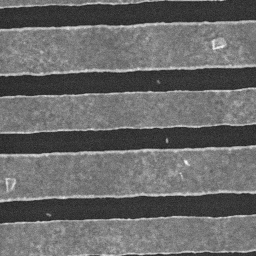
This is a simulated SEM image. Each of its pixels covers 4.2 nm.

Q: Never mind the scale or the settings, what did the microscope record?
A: lines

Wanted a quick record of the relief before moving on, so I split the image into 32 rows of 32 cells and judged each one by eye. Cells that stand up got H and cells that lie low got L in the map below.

HHHHHHHHHHHLLLLLLLLLLLLLLLLLLLLL
LLLLLLLLLLLLLLLLLLLLLLLLLLLLLLLL
LLLLLLLLLLLLLLLLLLLLLLLLLLLLLLLL
LLLHHHHHHHHHHHHHHHHHHHHHHHHHHHHH
HHHHHHHHHHHHHHHHHHHHHHHHHHHHHHHH
HHHHHHHHHHHHHHHHHHHHHHHHHHHHHHHH
HHHHHHHHHHHHHHHHHHHHHHHHHHHHHHHH
HHHHHHHHHHHHHHHHHHHHHHHHHHHHHHHH
HHHHHHHHHHHHHHHHHHHHHHHHHLLLLLLL
HLLLLLLLLLLLLLLLLLLLLLLLLLLLLLLL
LLLLLLLLLLLLLLLLLLLLLLLLLLLLLLLL
LLLLLLLLLLLLLLLLLLHLLHHHHHHHHHHH
HHHHHHHHHHHHHHHHHHHHHHHHHHHHHHHH
HHHHHHHHHHHHHHHHHHHHHHHHHHHHHHHH
HHHHHHHHHHHHHHHHHHHHHHHHHHHHHHHH
HHHHHHHHHHHHHHHHHHHHHHHHHHHHHHHH
HHHHHLLLLLLLLLLLLLLLLLLLLLLLLLLL
LLLLLLLLLLLLLLLLLLLLLLLLLLLLLLLL
LLLLLLLLLLLLLLLLLLLLLLLLLHHHHHHH
HHHHHHHHHHHHHHHHHHHHHHHHHHHHHHHH
HHHHHHHHHHHHHHHHHHHHHHHHHHHHHHHH
HHHHHHHHHHHHHHHHHHHHHHHHHHHHHHHH
HHHHHHHHHHHHHHHHHHHHHHHHHHHHHHHH
HHHHHHHHHHHHHHHHHHHHHHHHHHHHHHHH
HHHHHHHHHHHHHHHHHHLHHLLLLLLLLLLL
LLLLLLLLLLLLLLLLLLLLLLLLLLLLLLLL
LLLLLLLLLLLLLLLLLLLLLLLLLLLLLLLL
LLLLLLLLLLHHHHHHHHHHHHHHHHHHHHHH
HHHHHHHHHHHHHHHHHHHHHHHHHHHHHHHH
HHHHHHHHHHHHHHHHHHHHHHHHHHHHHHHH
HHHHHHHHHHHHHHHHHHHHHHHHHHHHHHHH
HHHHHHHHHHHHHHHHHHHHHHHHHHHHHHHL